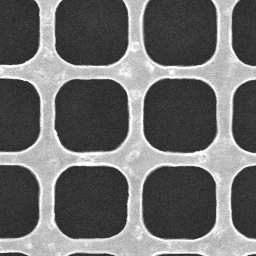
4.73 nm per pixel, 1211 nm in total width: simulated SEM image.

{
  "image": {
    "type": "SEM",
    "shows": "holes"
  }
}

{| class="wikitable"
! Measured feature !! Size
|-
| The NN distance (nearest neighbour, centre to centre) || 0.411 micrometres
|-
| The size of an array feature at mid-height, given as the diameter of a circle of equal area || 374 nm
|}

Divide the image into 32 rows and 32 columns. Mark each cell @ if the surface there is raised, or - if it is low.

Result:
-----@@---------@@---------@@---
-----@@---------@@---------@@---
-----@@---------@@---------@@---
-----@@---------@@---------@@---
-----@@---------@@---------@@---
-----@@---------@@---------@@---
-----@@---------@@---------@@---
----@@@@-------@@@@-------@@@@--
@@@@@@@@@@@@@@@@@@@@@@@@@@@@@@@@
@@@@@@@@@@@@@@@@@@@@@@@@@@@@@@@@
----@@@@-------@@@@-------@@@@--
-----@@---------@@---------@@---
-----@@---------@@---------@@---
-----@@---------@@---------@@---
-----@@---------@@---------@@---
-----@@---------@@---------@@---
-----@@---------@@---------@@---
-----@@---------@@---------@@---
----@@@@-------@@@@-------@@@@--
@@@@@@@@@@@@@@@@@@@@@@@@@@@@@@@@
@@@@@@@@@@@@@@@@@@@@@@@@@@@@@@@@
----@@@@-------@@@@-------@@@@--
-----@@---------@@---------@@---
-----@@---------@@---------@@---
-----@@---------@@---------@@---
-----@@---------@@---------@@---
-----@@---------@@---------@@---
-----@@---------@@---------@@---
----@@@---------@@---------@@---
---@@@@@------@@@@@------@@@@@@-
@@@@@@@@@@@@@@@@@@@@@@@@@@@@@@@@
@@@@@@@@@@@@@@@@@@@@@@@@@@@@@@@@